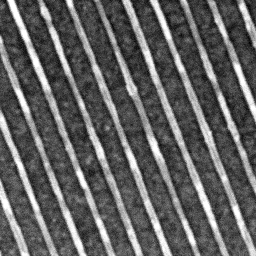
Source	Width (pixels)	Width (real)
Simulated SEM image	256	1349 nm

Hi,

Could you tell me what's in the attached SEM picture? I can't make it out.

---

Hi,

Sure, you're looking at parallel lines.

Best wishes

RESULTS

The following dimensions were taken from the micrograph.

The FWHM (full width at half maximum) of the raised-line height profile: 26.4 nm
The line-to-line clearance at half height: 115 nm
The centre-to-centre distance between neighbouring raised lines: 140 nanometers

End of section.